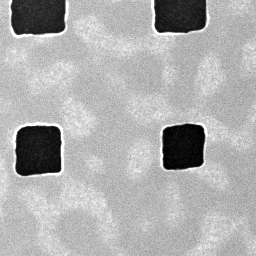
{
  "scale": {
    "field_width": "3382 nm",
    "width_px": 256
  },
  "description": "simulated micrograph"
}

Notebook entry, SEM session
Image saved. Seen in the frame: holes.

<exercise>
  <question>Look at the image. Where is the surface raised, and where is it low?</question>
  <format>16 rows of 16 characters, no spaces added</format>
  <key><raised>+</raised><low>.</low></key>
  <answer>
+...++++++...+++
+...++++++...+++
++++++++++++++++
++++++++++++++++
++++++++++++++++
++++++++++++++++
++++++++++++++++
++++++++++++++++
+...++++++...+++
+...++++++...+++
+...++++++..++++
++++++++++++++++
++++++++++++++++
++++++++++++++++
++++++++++++++++
++++++++++++++++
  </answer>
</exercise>